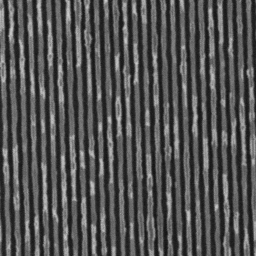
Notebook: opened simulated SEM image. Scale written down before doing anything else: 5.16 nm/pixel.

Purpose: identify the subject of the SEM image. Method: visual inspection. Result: parallel lines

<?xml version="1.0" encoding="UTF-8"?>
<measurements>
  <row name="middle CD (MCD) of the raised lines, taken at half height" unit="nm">23.9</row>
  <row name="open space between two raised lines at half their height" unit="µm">0.029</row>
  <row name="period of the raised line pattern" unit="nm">49.1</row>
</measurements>